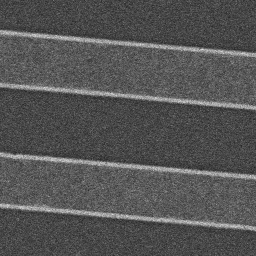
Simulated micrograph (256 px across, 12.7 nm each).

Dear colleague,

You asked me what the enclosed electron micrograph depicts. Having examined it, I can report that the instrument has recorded one or a few lines or trenches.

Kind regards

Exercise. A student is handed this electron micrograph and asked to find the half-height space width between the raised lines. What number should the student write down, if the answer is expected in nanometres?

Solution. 880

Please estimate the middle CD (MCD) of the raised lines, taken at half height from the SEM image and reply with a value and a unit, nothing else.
660 nm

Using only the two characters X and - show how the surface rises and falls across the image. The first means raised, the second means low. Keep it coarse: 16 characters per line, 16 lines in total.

----------------
----------------
XXXXX-----------
XXXXXXXXXXXXXXXX
XXXXXXXXXXXXXXXX
--XXXXXXXXXXXXXX
-------------XXX
----------------
----------------
----------------
XXXXXXXXX-------
XXXXXXXXXXXXXXXX
XXXXXXXXXXXXXXXX
--------XXXXXXXX
----------------
----------------